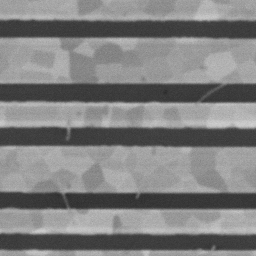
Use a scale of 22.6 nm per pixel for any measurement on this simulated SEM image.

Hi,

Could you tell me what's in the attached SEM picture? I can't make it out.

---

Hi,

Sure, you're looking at lines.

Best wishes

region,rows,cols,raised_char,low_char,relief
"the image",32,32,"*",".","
********************************
********************************
................................
................................
................................
********************************
********************************
********************************
********************************
********************************
................................
................................
................................
********************************
********************************
********************************
................................
................................
********************************
********************************
********************************
********************************
********************************
********************************
................................
................................
********************************
********************************
********************************
................................
................................
********************************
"